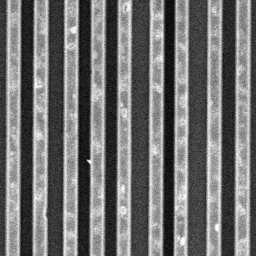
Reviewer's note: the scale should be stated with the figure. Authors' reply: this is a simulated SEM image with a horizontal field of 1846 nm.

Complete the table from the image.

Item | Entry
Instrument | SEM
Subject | parallel lines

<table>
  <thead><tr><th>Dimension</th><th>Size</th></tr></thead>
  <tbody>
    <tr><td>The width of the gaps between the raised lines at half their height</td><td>101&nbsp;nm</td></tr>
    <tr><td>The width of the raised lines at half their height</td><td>100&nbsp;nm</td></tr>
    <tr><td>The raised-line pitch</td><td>207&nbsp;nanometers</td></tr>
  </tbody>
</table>